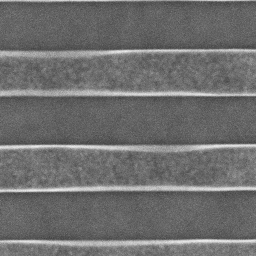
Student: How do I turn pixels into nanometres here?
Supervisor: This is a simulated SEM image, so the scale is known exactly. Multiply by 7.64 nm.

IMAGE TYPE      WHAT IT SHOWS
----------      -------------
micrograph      wiring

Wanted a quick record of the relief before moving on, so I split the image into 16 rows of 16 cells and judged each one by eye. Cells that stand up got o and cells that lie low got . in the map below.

................
................
................
oooooooooooooooo
oooooooooooooooo
oooooooooooooooo
................
................
................
oooooooooooooooo
oooooooooooooooo
oooooooooooooooo
................
................
................
oooooooooooooooo